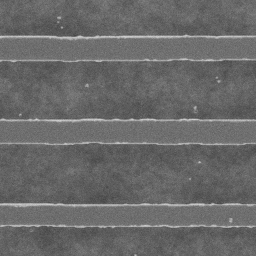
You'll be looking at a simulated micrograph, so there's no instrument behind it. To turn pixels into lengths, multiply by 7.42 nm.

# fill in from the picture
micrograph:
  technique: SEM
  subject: lines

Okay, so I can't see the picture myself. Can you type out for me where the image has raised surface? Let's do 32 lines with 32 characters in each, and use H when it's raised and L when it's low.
LLLLLLLLLLLLLLLLLLLLLLLLLLLLLLLL
LLLLLLLLLLLLLLLLLLLLLLLLLLLLLLLL
LLLLLLLLLLLLLLLLLLLLLLLLLLLLLLLL
LLLLLLLLLLLLLLLLLLLLLLLLLLLLLLLL
LLLLLLLLLLLLLLLLLLLLLLLHLLLLLLLL
HHHHHHHHHHHHHHHHHHHHHHHHHHHHHHHH
HHHHHHHHHHHHHHHHHHHHHHHHHHHHHHHH
HHHHHHHHHHHHHHHHHHHHHHLHHHHHLLLL
LLLLLLLLLLLLLLLLLLLLLLLLLLLLLLLL
LLLLLLLLLLLLLLLLLLLLLLLLLLLLLLLL
LLLLLLLLLLLLLLLLLLLLLLLLLLLLLLLL
LLLLLLLLLLLLLLLLLLLLLLLLLLLLLLLL
LLLLLLLLLLLLLLLLLLLLLLLLLLLLLLLL
LLLLLLLLLLLLLLLLLLLLLLLLLLLLLLLL
LLLLLLLLLLLLLLLLLLLLLLLLLLLLLLLL
HHHHHHHHHHHHHHHHHHHHHHHHHHHHHHHH
HHHHHHHHHHHHHHHHHHHHHHHHHHHHHHHH
HHHHHHHHHHHHHHHHHHHHHHHHHHHHHHHH
LLLLLLLLLLLLLLLLLLLLLLLLLLLLLLLL
LLLLLLLLLLLLLLLLLLLLLLLLLLLLLLLL
LLLLLLLLLLLLLLLLLLLLLLLLLLLLLLLL
LLLLLLLLLLLLLLLLLLLLLLLLLLLLLLLL
LLLLLLLLLLLLLLLLLLLLLLLLLLLLLLLL
LLLLLLLLLLLLLLLLLLLLLLLLLLLLLLLL
LLLLLLLLLLLLLLLLLLLLLLLLLLLLLLLL
LLLLLLLLLLLLLLLLLLLLLLLLLLLLLLLL
HHHHHHHHHHHHHHHHHHHHHHHHHHHHHHHH
HHHHHHHHHHHHHHHHHHHHHHHHHHHHHHHH
LLLLLLLLLLLLLLLLLLLLLLLLLLLLLLLL
LLLLLLLLLLLLLLLLLLLLLLLLLLLLLLLL
LLLLLLLLLLLLLLLLLLLLLLLLLLLLLLLL
LLLLLLLLLLLLLLLLLLLLLLLLLLLLLLLL